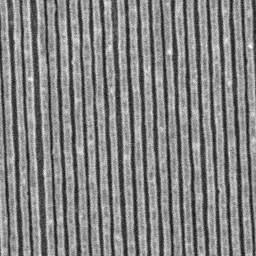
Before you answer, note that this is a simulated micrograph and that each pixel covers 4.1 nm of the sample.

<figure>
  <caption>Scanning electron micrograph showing parallel lines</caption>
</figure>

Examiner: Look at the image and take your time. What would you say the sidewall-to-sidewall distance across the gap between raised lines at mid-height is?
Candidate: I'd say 19.4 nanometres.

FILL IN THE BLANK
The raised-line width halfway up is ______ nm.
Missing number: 27.1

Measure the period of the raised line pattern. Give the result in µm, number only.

0.0477